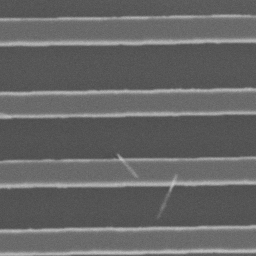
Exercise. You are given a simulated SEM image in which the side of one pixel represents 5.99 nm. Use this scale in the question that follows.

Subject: lines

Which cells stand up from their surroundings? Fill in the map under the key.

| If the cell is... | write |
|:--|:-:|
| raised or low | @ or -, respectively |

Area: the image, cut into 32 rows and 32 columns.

--------------------------------
--------------------------------
@@@@@@@@@@@@@@@@@@@@@@@@@@@@@@@@
@@@@@@@@@@@@@@@@@@@@@@@@@@@@@@@@
@@@@@@@@@@@@@@@@@@@@@@@@@@@@@@@@
@@@@@@@@@@@@@@@-@@--------------
--------------------------------
--------------------------------
--------------------------------
--------------------------------
--------------------------------
-----@@@@@@@@@@@@@@@@@@@@@@@@@@@
@@@@@@@@@@@@@@@@@@@@@@@@@@@@@@@@
@@@@@@@@@@@@@@@@@@@@@@@@@@@@@@@@
@@@@@@@@@@@@@@@@----------------
--------------------------------
--------------------------------
--------------------------------
--------------------------------
--------------------------------
@@@@@@@@@@@@@@@@@@@@@@@@@@@@@@@@
@@@@@@@@@@@@@@@@@@@@@@@@@@@@@@@@
@@@@@@@@@@@@@@@@@@@@@@@@@@@@@@@@
--------------------------------
--------------------------------
--------------------------------
--------------------------------
--------------------------------
------------------@@@@@@@@@@@@@@
@@@@@@@@@@@@@@@@@@@@@@@@@@@@@@@@
@@@@@@@@@@@@@@@@@@@@@@@@@@@@@@@@
@@@@@@@@@@@@@@@@@@@@@@@@@@-@@@@@